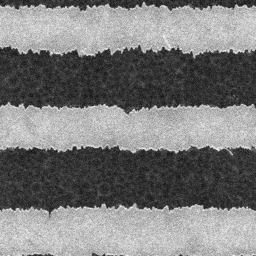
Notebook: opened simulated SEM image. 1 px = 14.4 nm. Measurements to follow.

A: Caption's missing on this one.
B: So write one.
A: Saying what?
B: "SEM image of one or a few lines or trenches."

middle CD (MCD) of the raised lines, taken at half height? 610 nm